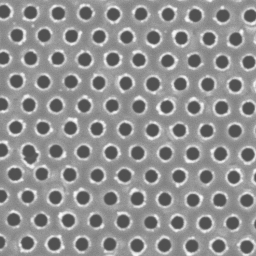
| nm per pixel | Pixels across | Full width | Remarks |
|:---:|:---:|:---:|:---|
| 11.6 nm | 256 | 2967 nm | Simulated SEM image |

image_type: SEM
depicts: a regular array of holes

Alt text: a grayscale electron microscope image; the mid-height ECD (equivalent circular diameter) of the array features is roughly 152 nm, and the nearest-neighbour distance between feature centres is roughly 306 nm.